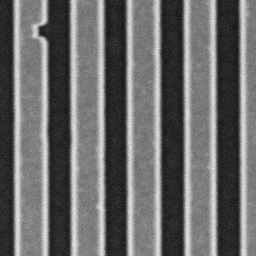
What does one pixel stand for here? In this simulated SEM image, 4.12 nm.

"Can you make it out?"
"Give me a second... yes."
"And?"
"parallel lines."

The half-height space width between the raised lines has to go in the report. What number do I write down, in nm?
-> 123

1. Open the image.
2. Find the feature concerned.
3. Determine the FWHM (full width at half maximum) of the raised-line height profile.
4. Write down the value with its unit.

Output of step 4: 112 nm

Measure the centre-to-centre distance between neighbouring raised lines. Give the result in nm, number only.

233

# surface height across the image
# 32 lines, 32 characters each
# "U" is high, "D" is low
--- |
DDUUUDDDDUUUUDDDUUUUDDDUUUUDDDUU
DDUUUDDDDUUUUDDDUUUUDDDUUUUDDDUU
DDUUUDDDDUUUUDDDUUUUDDDUUUUDDDUU
DDUUUDDDDUUUUDDDUUUUDDDUUUUDDDUU
DDUUUDDDDUUUUDDDUUUUDDDUUUUDDDUU
DDUUUDDDDUUUUDDDUUUUDDDUUUUDDDUU
DDUUUUDDDUUUUDDDUUUUDDDUUUUDDDUU
DDUUUUDDDUUUUDDDUUUUDDDUUUUDDDUU
DDUUUUDDDUUUUDDDUUUUDDDUUUUDDDUU
DDUUUUDDDUUUUDDDUUUUDDDUUUUDDDUU
DDUUUUDDDUUUUDDDUUUUDDDUUUUDDDUU
DDUUUUDDDUUUUDDDUUUUDDDUUUUDDDUU
DDUUUUDDDUUUUDDDUUUUDDDUUUUDDDUU
DDUUUUDDDUUUUDDDUUUUDDDUUUUDDDUU
DDUUUUDDDUUUUDDDUUUUDDDUUUUDDDDU
DDUUUUDDDUUUUDDDUUUUDDDUUUUDDDDU
DDUUUUDDDUUUUDDDUUUUDDDUUUUDDDDU
DDUUUUDDDUUUUDDDUUUUDDDUUUUDDDDU
DDUUUUDDDUUUUDDDUUUUDDDUUUUDDDDU
DDUUUUDDDUUUUDDDUUUUDDDUUUUDDDDU
DDUUUUDDDUUUUDDDUUUUDDDUUUUDDDDU
DDUUUUDDDUUUUDDDUUUUDDDUUUUDDDUU
DDUUUUDDDUUUUDDDUUUUDDDUUUUDDDDU
DDUUUUDDDUUUUDDDUUUUDDDUUUUDDDDU
DDUUUUDDDUUUUDDDUUUUDDDUUUUDDDDU
DDUUUUDDDUUUUDDDUUUUDDDDUUUDDDDU
DDUUUUDDDUUUUDDDUUUUDDDDUUUDDDDU
DDUUUUDDDUUUUDDDUUUUDDDDUUUDDDDU
DDUUUUDDDUUUUDDDUUUUDDDDUUUDDDDU
DDUUUUDDDUUUUDDDUUUUDDDDUUUDDDDU
DDUUUUDDDUUUUDDDUUUUDDDDUUUDDDDU
DDUUUUDDDUUUUDDDUUUUDDDDUUUDDDDU